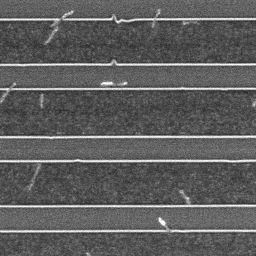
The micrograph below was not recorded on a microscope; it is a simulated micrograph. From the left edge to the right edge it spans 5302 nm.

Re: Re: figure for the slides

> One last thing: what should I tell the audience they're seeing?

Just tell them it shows one or a few lines or trenches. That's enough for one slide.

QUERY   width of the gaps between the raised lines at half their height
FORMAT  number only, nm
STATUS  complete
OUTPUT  518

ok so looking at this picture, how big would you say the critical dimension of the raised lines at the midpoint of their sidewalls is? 932 nanometres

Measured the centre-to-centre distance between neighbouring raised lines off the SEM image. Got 1470 nm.